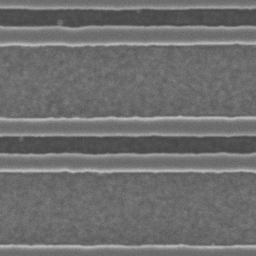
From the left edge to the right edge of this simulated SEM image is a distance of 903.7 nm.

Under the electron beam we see lines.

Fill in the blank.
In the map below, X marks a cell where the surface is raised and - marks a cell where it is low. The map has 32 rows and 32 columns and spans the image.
XXXXXXXXXXXXXXXXXXXXXXXXXXXXXXXX
--------------------------------
--------------------------------
XXXXXXXXX-XXXXXXXXXXXXXXXXXXXXXX
XXXXXXXXXXXXXXXXXXXXXXXXXXXXXXXX
XXXXXXXXXXXXXXX-XXXXXXXX--------
--------------------------------
--------------------------------
--------------------------------
--------------------------------
--------------------------------
--------------------------------
--------------------------------
--------------------------------
--------------------------------
XXXXXXXXXXXXXXXXXXXXXXXXXXXXXXXX
XXXXXXXXXXXXXXXXXXXXXXXXXXXXXXXX
--------------------------------
--------------------------------
XXXXXXXXXXXXXXXXXXXXXXXXXXXXXXXX
XXXXXXXXXXXXXXXXXXXXXXXXXXXXXXXX
---------X---------------X-X----
--------------------------------
--------------------------------
--------------------------------
--------------------------------
--------------------------------
--------------------------------
--------------------------------
--------------------------------
--------------------------------
XXXXXXXXXXXXXXXXXXXXXXXXXXXXXXXX